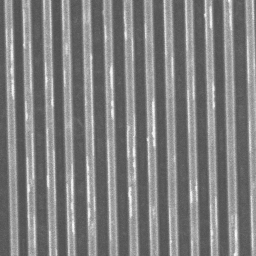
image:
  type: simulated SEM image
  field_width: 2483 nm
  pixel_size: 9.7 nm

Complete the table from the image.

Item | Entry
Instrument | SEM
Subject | parallel lines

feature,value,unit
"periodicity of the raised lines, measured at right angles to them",193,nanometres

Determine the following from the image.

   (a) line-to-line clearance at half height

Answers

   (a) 113 nanometers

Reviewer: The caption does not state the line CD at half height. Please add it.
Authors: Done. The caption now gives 86 nm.